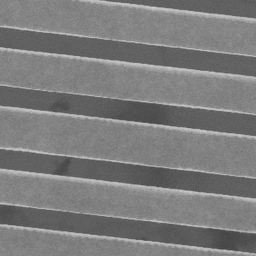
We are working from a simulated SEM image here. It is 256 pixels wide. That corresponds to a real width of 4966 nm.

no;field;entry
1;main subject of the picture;lines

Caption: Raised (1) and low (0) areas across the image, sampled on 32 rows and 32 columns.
11111111111111110000000000000000
11111111111111111111111100000000
11111111111111111111111111111111
00111111111111111111111111111111
00000000001111111111111111111111
00000000000000000001111111111111
11110000000000000000000000011111
11111111111110000000000000000000
11111111111111111111100000000000
11111111111111111111111111111100
11111111111111111111111111111111
00000001111111111111111111111111
00000000000000001111111111111111
11000000000000000000000000111111
11111111110000000000000000000000
11111111111111111100000000000000
11111111111111111111111111000000
11111111111111111111111111111111
11111111111111111111111111111111
00000000011111111111111111111111
00000000000000000111111111111111
11000000000000000000000000111111
11111111111100000000000000000000
11111111111111111110000000000000
11111111111111111111111111110000
11111111111111111111111111111111
00000000011111111111111111111111
00000000000000000011111111111111
11110000000000000000000000011111
11111111111100000000000000000000
11111111111111111111100000000000
11111111111111111111111111111100